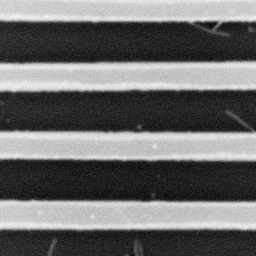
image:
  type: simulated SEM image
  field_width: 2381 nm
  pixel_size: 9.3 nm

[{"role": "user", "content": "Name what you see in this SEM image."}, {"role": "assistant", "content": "lines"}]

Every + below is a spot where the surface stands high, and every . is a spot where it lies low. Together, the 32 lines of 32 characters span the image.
++++++++++++++++++++++++++++++++
++++++++++++++++++++++++++++++++
...........+++++++++++++++++++++
................................
................................
................................
................................
................................
++++++++++++++++++++++++++++++++
++++++++++++++++++++++++++++++++
++++++++++++++++++++++++++++++++
................................
................................
................................
................................
................................
................................
++++++++++++++++++++++++++++++++
++++++++++++++++++++++++++++++++
++++++++++++++++++++++++++++++++
................................
................................
................................
................................
................................
++++++++++++++++++++++++++++++++
++++++++++++++++++++++++++++++++
++++++++++++++++++++++++++++++++
.......+++++++++++............++
................................
................................
................................